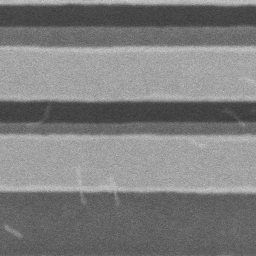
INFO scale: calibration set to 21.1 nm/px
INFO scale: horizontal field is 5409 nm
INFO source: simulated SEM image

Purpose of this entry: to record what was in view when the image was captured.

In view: lines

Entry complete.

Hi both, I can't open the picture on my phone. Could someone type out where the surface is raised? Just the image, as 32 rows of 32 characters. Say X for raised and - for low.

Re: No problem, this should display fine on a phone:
XXXXXXXX--X--X--XXXXXXXXXXXXXXXX
--------------------------------
--------------------------------
XXXXXXXXXXXXXXXXXXXXXXXXXXXXXXXX
XXXXXXXXXXXXXXXXXXXXXXXXXXXXXXXX
XXXXXXXXXXXXXXXXXXXXXXXXXXXXXXXX
XXXXXXXXXXXXXXXXXXXXXXXXXXXXXXXX
XXXXXXXXXXXXXXXXXXXXXXXXXXXXXXXX
XXXXXXXXXXXXXXXXXXXXXXXXXXXXXXXX
XXXXXXXXXXXXXXXXXXXXXXXXXXXXXXXX
XXXXXXXXXXXXXXXXXXXXXXXXXXXXXXXX
XXXXXXXXXXXXXXXXXXXXXXXXXXXXXXXX
XXXXXXXXXXXXXXXXXXXXXXXXXXXXXXXX
--------------------------------
--------------------------------
X-XXX-----------XXXXXXXXXXXXXXXX
XXXXXXXXXXXXXXXXXXXXXXXXXXXXXXXX
XXXXXXXXXXXXXXXXXXXXXXXXXXXXXXXX
XXXXXXXXXXXXXXXXXXXXXXXXXXXXXXXX
XXXXXXXXXXXXXXXXXXXXXXXXXXXXXXXX
XXXXXXXXXXXXXXXXXXXXXXXXXXXXXXXX
XXXXXXXXXXXXXXXXXXXXXXXXXXXXXXXX
XXXXXXXXXXXXXXXXXXXXXXXXXXXXXXXX
XXXXXXXXXXXXXXXXXXXXXXXXXXXXXXXX
--------------------------------
--------------------------------
--------------------------------
--------------------------------
--------------------------------
--------------------------------
--------------------------------
--------------------------------